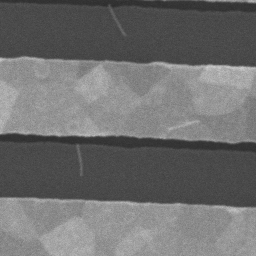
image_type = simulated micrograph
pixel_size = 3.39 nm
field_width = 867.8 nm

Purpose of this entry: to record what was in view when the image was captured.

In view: lines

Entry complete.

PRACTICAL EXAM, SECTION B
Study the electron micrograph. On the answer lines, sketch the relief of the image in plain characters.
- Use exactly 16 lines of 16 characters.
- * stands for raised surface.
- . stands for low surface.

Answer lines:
................
................
................
................
****************
****************
****************
****************
...*.**.********
................
................
................
****............
****************
****************
****************